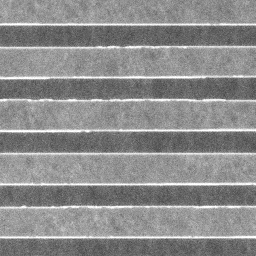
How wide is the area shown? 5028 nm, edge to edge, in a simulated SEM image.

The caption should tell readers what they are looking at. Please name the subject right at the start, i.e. lines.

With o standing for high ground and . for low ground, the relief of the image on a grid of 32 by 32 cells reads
oooooooooooooooooooooooooooooooo
oooooooooooooooooooooooooooooooo
oooooooooooooooooooooooooooooooo
................................
................................
................................
oooooooooooooooooooooooooooooooo
oooooooooooooooooooooooooooooooo
oooooooooooooooooooooooooooooooo
oooooooooooooooooooooooooooooooo
................................
................................
oooo.oo.oo.ooooooooooooo.oooo...
oooooooooooooooooooooooooooooooo
oooooooooooooooooooooooooooooooo
oooooooooooooooooooooooooooooooo
................................
................................
................................
oooooooooooooooooooooooooooooooo
oooooooooooooooooooooooooooooooo
oooooooooooooooooooooooooooooooo
oooooooooooooooooooooooooooooooo
................................
................................
................................
oooooooooooooooooooooooooooooooo
oooooooooooooooooooooooooooooooo
oooooooooooooooooooooooooooooooo
oooooooooooooooooooooooooooooooo
................................
................................